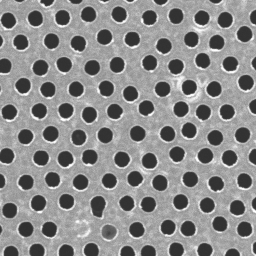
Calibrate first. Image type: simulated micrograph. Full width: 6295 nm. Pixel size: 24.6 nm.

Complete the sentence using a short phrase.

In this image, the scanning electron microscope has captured a regular array of holes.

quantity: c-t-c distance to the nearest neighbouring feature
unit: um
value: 0.587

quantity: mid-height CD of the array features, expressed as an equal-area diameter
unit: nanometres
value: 384